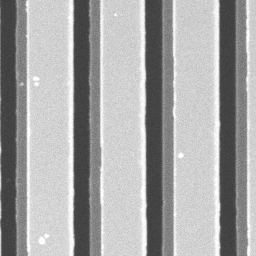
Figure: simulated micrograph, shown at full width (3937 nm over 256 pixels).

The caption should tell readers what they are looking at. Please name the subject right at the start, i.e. lines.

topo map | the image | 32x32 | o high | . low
..ooooooo..ooooooo..ooooooo...oo
..ooooooo..ooooooo..ooooooo...oo
..ooooooo..ooooooo..ooooooo...oo
..ooooooo..ooooooo..ooooooo...oo
..ooooooo..ooooooo..ooooooo...oo
..ooooooo..ooooooo..ooooooo...oo
..ooooooo..ooooooo..ooooooo...oo
..ooooooo..ooooooo..ooooooo...oo
..ooooooo..ooooooo..ooooooo...oo
..ooooooo..ooooooo..ooooooo...oo
..ooooooo..ooooooo..ooooooo...oo
..ooooooo..ooooooo..ooooooo...oo
..ooooooo..ooooooo..ooooooo...oo
..ooooooo..ooooooo..ooooooo...oo
..ooooooo..ooooooo..ooooooo...oo
..ooooooo..ooooooo..ooooooo...oo
..ooooooo..ooooooo..ooooooo...oo
..ooooooo..ooooooo..ooooooo...oo
..ooooooo..ooooooo..ooooooo...oo
..ooooooo..ooooooo..ooooooo...oo
..ooooooo..ooooooo..ooooooo...oo
..ooooooo..ooooooo..ooooooo...oo
..ooooooo..ooooooo..ooooooo...oo
..ooooooo..ooooooo..ooooooo...oo
..ooooooo..ooooooo..ooooooo...oo
..ooooooo..ooooooo..ooooooo...oo
..ooooooo..ooooooo..ooooooo...oo
..ooooooo..ooooooo..ooooooo...oo
..ooooooo..ooooooo..ooooooo...oo
..ooooooo..ooooooo..ooooooo...oo
..ooooooo..ooooooo..ooooooo...oo
..ooooooo..ooooooo..ooooooo...oo